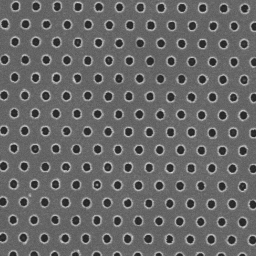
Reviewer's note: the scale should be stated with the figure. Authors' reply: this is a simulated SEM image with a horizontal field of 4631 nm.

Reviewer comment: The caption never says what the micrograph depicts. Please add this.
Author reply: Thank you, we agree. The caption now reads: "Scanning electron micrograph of a regular array of holes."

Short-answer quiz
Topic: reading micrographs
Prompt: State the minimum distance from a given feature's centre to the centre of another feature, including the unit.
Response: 366 nanometres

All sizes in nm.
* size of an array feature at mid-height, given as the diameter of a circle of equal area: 146